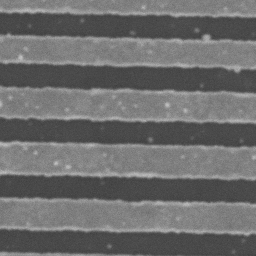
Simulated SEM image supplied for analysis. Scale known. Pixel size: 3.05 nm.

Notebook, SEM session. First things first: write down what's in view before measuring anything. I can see lines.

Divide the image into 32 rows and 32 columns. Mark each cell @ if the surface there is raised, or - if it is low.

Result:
@@@@@@@@@@@@@@@@@@@@@@@@@@@@@@@@
-------@@@@@@@@@@@@@@@@@@@@@@@@@
--------------------------------
--------------------------------
@@------------------------------
@@@@@@@@@@@@@@@@@@@@@@@@@@@@@@@@
@@-@@-@@@@@@@@@@@@@@@@@@@@@@@@@@
@@@@@@@@@@@@@@@@@@@@@@@@@@@@@@@@
----------------------------@@@@
--------------------------------
--------------------------------
@@@@@@@@@@@@@@@@@@@@@@@@@--@@---
@@@@@@@@@@@@@@@@@@@@@@@@@@@@@@-@
@@@@@@@@@@@@@@@@@@@@@@@@@@@@@--@
@@@@@@@@@@@@@@@@@@@@@@@@@@@@@@@@
--------------------------------
--------------------------------
--------------------------------
-@@@@@@@@@@@@@@@@@@@@@@@@@@@--@@
@@@@@@@@@@@@@@@@@@-@@@@@@@@@@@@@
-@@@@@@@@@@@@@@@@@--@@@@@@@@@@@@
@@@@@@@@@@@@@@@@---@@@@@@@@@@@@@
--------------------------------
--------------------------------
--------------------------------
@@@@@@@@@@@@@@@@@-@@-@@@@@@@@@@-
@@@@@@@@@@@@@@@@@@@@@@@@@@@@@@@@
@@@@@@@@@@@@@@@@@@@@@@@@@@@@@@@@
@@@@@@@@@@@@@@@@@@@@@@@@@@@@@@@@
--------------------------------
--------------------------------
--------------------------------